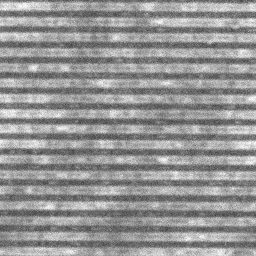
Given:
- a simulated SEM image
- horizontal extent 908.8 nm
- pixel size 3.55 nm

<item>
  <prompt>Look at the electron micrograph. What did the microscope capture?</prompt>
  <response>parallel lines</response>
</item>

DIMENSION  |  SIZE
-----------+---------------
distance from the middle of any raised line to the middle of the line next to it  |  15.3 px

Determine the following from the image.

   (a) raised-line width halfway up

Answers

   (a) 29.3 nm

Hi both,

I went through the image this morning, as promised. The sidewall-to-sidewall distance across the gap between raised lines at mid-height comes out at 26.2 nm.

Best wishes